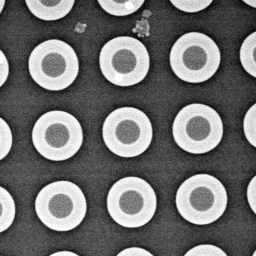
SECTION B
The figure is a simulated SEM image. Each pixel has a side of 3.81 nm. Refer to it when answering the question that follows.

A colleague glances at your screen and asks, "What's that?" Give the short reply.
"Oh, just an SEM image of an array of small figures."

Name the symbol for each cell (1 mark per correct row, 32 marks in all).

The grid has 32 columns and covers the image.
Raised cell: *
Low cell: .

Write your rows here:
*..******...******....****.....*
....*****....****...............
................................
................................
.......................***.....*
.....***.....*****....*****...**
....*****....*****...******...**
*...******..*******..******...**
*...******...******...*****....*
*...******...*****....****......
.....****.....***...............
................................
................................
...............**......***.....*
.....****.....****....*****....*
*...******...******...******..**
*...******...******...******...*
*...******...******...******...*
*...******....****.....****.....
*....****......**...............
................................
................................
...............***.....****....*
.....*****....*****...******...*
*....*****...******...******...*
**..*******..******...******...*
**...******...*****...******....
**...*****....*****....****.....
*.....***.......................
................................
................................
.......**......****....*****....